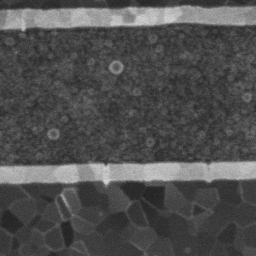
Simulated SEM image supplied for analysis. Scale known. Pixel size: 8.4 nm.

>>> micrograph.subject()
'one or a few lines or trenches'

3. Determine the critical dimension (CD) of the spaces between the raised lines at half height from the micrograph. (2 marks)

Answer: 1290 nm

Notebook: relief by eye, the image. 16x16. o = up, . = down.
oooooooooooooooo
................
................
................
................
................
................
................
................
................
................
oooooooooooooooo
oooooooooooooooo
oooooooooooooooo
oooooooooooooooo
oooooooooooooooo